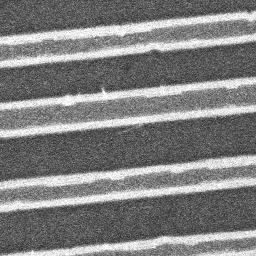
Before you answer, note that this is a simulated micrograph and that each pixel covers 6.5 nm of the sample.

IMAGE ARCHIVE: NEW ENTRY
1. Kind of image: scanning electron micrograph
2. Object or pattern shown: one or a few lines or trenches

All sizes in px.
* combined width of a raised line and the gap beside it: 72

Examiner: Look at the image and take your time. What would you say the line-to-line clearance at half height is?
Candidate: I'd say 325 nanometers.